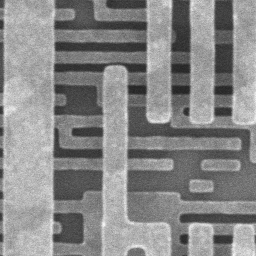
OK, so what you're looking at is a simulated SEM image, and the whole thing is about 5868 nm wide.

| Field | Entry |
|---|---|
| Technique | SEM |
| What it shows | wiring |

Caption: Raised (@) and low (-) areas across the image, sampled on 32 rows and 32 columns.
-@@@@@@-----------@@@---@@@--@@@
-@@@@@@-----------@@@---@@@--@@@
-@@@@@@------------@@---@@@--@@@
-@@@@@@------------@@---@@@--@@@
-@@@@@@------------@@---@@@--@@@
-@@@@@@------------@@---@@@--@@@
-@@@@@@------------@@---@@@--@@@
-@@@@@@------------@@---@@@--@@@
-@@@@@@------@@@--@@@---@@@--@@@
-@@@@@@------@@@--@@@---@@@--@@@
-@@@@@@------@@@--@@@---@@@--@@@
-@@@@@@------@@@--@@@---@@@--@@@
-@@@@@@------@@@--@@@---@@@--@@@
-@@@@@@------@@@--@@@---@@@--@@@
-@@@@@@------@@@--@@@---@@@--@@@
-@@@@@@------@@@----------------
-@@@@@@------@@@----------------
-@@@@@@------@@@----------------
-@@@@@@------@@@----------------
-@@@@@@------@@@----------------
-@@@@@@------@@@----------------
-@@@@@@------@@@----------------
-@@@@@@------@@@----------------
-@@@@@@------@@@----------------
-@@@@@@------@@@----------------
-@@@@@@------@@@----------------
-@@@@@@------@@@----------------
-@@@@@@------@@@----------------
-@@@@@-------@@@@@@@@---@@@--@@@
-@@@@@-------@@@@@@@@---@@@--@@@
-@@@@@-------@@@@@@@@---@@@--@@@
@@@@@@-------@@@--@@@---@@@--@@@